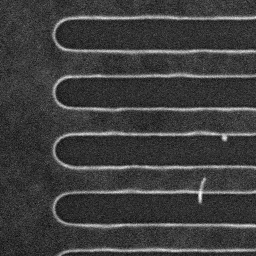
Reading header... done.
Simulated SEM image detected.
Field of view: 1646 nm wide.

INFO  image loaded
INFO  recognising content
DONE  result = groups of lines, slits or small figures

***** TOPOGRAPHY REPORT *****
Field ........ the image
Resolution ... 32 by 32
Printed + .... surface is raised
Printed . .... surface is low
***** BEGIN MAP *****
++++++++++++++++++++++++++++++++
++++++++++++++++++++++++++++++++
++++++++........................
+++++++.........................
+++++++.........................
+++++++.........................
++++++++++++++++++++++++++++++++
++++++++++++++++++++++++++++++++
++++++++++++++++++++++++++++++++
++++++++++++++++++++++.+++++++++
+++++++.........................
+++++++.........................
+++++++.........................
++++++++++......................
++++++++++++++++++++++++++++++++
++++++++++++++++++++++++++++++++
++++++++++++++++++++++++++++++++
+++++++.........................
+++++++.........................
+++++++.........................
++++++++........................
++++++++++++++++++++++++++++++++
++++++++++++++++++++++++++++++++
++++++++++++++++++++++++++++++++
++++++++........................
+++++++.........................
+++++++.........................
++++++++........................
++++++++++++++++++++++++++++++++
++++++++++++++++++++++++++++++++
++++++++++++++++++++++++++++++++
++++++++........................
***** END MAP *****